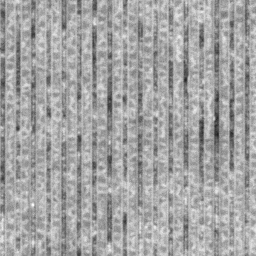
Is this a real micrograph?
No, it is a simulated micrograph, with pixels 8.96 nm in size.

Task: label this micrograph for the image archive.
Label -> parallel lines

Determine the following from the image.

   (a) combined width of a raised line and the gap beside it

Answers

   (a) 137 nanometres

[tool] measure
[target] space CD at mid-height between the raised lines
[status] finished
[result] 0.0504 µm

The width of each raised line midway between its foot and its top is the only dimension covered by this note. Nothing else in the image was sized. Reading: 91.8 nm